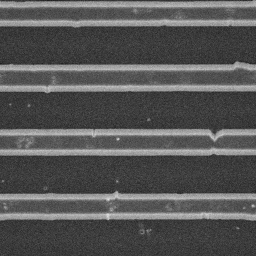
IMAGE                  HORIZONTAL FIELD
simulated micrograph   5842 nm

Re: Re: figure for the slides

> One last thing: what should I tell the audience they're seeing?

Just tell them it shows one or a few lines or trenches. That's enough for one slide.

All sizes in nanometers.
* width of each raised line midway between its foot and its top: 488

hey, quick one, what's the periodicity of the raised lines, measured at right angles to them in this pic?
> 1470 nm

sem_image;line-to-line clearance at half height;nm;978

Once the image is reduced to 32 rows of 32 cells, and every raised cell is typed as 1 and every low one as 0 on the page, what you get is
00000110000000000000000000000001
11111111111111111111111111111111
11111111111111111111111111111111
00000000000000000000000000000000
00000000000000000000000000000000
00000000000000000000000000000000
00000000000000000000000000000000
00000000000000000000000000000000
11111111111111111111111111111111
11111111111111111111111111111111
11111111111111111111111111111111
00000000000000000000000000000000
00000000000000000000000000000000
00000000000000000000000000000000
00000000000000000000000000000000
00000000000000000000000000000000
00000000000000000000000000001111
11111111111111111111111111111111
11111111111111111111111111111111
00000000000000000000000000000000
00000000000000000000000000000000
00000000000000000000000000000000
00000000000000000000000000000000
00000000000000000000000000000000
00000000000000100000000000000000
11111111111111111111111111111111
11111111111111111111111111111111
00000000000000000000000000000000
00000000000000000000000000000000
00000000000000000000000000000000
00000000000000000000000000000000
00000000000000000000000000000000